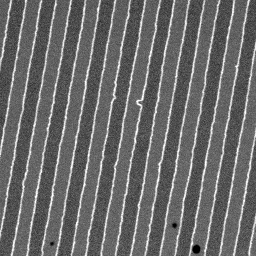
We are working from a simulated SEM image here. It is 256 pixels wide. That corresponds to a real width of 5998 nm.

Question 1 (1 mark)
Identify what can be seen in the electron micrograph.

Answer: parallel lines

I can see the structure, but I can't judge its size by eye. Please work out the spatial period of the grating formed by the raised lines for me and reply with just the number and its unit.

0.685 microns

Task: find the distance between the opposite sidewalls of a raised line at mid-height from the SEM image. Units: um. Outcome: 0.355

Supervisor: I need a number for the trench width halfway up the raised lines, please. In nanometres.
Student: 332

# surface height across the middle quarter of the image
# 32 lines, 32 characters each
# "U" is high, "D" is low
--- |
UUUDDDUUUUDDDDUUUDDDDUUUUDDDUUUU
UUDDDDUUUUDDDDUUUDDDDUUUDDDDUUUU
UUDDDDUUUUDDDUUUUDDDDUUUUDDDUUUU
UUDDDDUUUDDDDUUUUDDDDUUUDDDDUUUU
UUDDDUUUUDDDDUUUUDDDUUUUDDDDUUUU
UUDDDUUUUDDDDUUUUDDDUUUUDDDDUUUD
UDDDDUUUUDDDDUUUDDDDUUUUDDDDUUUD
UDDDDUUUUDDDUUUUDDDDUUUUDDDUUUUD
UDDDDUUUUDDDDUUUDDDDUUUUDDDUUUUD
UDDDDUUUUDDDUUUUDDUUUUUDDDDUUUUD
UDDDDUUUDDDDUUUUDDDUUUUDDDDUUUUD
UDDDUUUUDDDDUUUDDDDUUUUDDDDUUUDD
UDDDUUUUDDDDUUUDDDDUUUUDDDDUUUDD
DDDDUUUUDDDUUUUDDDDUUUUDDDUUUUDD
DDDDUUUUDDDUUUUDDDDUUUDDDDUUUUDD
DDDDUUUDDDDUUUUDDDUUUUDDDDUUUUDD
DDDDUUUDDDDUUUUDDDUUUUDDDDUUUDDD
DDDUUUUDDDDUUUDDDDUUUUDDDDUUUDDD
DDDUUUUDDDDUUUDDDDUUUUDDDDUUUDDD
DDDUUUUDDDUUUUDDDDUUUUDDDUUUUDDD
DDDUUUUDDDUUUUDDDDUUUDDDDUUUUDDD
DDDUUUDDDDUUUUDDDUUUUDDDDUUUUDDD
DDUUUUDDDDUUUUDDDUUUUDDDDUUUDDDD
DDUUUUDDDDUUUDDDDUUUUDDDDUUUDDDD
DDUUUUDDDUUUUDDDDUUUUDDDUUUUDDDD
DDUUUUDDDUUUUDDDDUUUUDDDUUUUDDDD
DDUUUUDDDUUUUDDDUUUUDDDDUUUUDDDD
DDUUUDDDDUUUUDDDUUUUDDDDUUUUDDDD
DUUUUDDDDUUUUDDDUUUUDDDDUUUUDDDU
DUUUUDDDDUUUDDDDUUUUDDDUUUUDDDDU
DUUUUDDDUUUUDDDDUUUUDDDUUUUDDDDU
DUUUUDDDUUUUDDDDUUUUDDDUUUUDDDDU